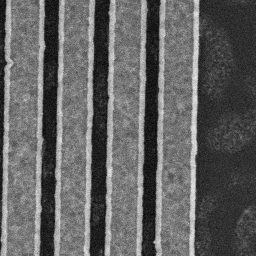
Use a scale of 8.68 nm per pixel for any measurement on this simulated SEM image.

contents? parallel lines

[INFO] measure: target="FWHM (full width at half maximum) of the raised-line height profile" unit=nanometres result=285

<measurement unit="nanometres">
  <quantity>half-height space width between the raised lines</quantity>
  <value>167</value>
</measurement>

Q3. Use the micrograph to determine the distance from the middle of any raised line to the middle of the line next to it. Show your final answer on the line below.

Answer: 446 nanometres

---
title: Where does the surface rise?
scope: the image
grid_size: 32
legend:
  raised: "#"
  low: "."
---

.####...###...####..#####.......
.####...###...####..####........
.####...####..####..####........
.####...###...####..####........
.####...###...####..#####.......
.####...###...####..#####.......
.####...###...####..#####.......
.####...###...####..####........
.####...###...####..####........
.####...###...####..####........
.####...###...####..####........
.####..####...####..####........
.####..####...####..####........
.####..####...####..####........
.####..####...####..####........
.####..####...####..####........
.####..####...####..####........
.####..####...####..####........
.####..####...####..####........
.####..####...####..####........
.####..####...####..####........
.####..####...####..####........
.####..####...####..####........
.####..####...####..####........
.####..####...####..####........
.####..####...###...####........
.####..####...###...####........
.####..####...###...####........
.####..####...###...####........
.####..####...###...####........
.####..####..####...####........
#####..####..####...####........